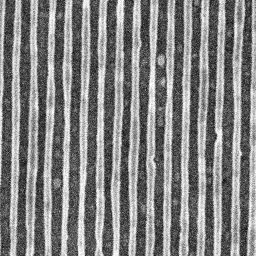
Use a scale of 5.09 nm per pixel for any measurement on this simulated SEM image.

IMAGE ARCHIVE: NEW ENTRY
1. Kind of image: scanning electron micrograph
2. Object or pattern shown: parallel lines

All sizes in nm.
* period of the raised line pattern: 86.8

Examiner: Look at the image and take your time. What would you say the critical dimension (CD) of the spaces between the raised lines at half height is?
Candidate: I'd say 57.9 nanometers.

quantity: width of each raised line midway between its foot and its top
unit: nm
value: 26.7